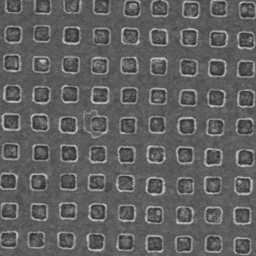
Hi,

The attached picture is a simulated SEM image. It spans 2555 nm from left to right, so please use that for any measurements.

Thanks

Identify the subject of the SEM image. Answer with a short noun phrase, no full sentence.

a regular array of holes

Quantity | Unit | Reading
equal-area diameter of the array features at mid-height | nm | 168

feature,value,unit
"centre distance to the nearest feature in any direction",283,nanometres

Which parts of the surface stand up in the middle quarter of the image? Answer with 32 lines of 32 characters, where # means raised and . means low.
....###....###....####....###...
....###....###....####....###...
########..######.#####...#####..
################################
################################
...#############################
...####....###....####...#####..
....###....###....###.....###...
....###....###....###.....###...
#.#####....####...####...####...
##############################..
################################
################################
...####....####..#####...#######
...####....###....###....####...
...####....###....###....###....
...####....###....###....####...
##############################..
################################
################################
.###############################
...####....###....###....####...
...###.....###....###....###....
...###.....###....###....###....
#########.####...#####..#####...
################################
################################
#.##############################
...###....###....############.##
...###....###.....###....###....
...###....###.....###....###....
..#####...####...####....###....